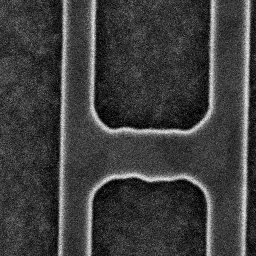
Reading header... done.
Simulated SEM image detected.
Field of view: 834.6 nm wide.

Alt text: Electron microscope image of one or a few lines or trenches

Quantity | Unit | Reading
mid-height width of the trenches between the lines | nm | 384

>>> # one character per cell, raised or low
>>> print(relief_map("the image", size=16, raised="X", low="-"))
----XX-------XXX
----XX-------XXX
----XX-------XXX
----XX-------XX-
----XX-------XX-
----XX-------XX-
----XX-------XX-
----XX-------XX-
----XXXXXXXXXXX-
----XXXXXXXXXXX-
----XXXXXXXXXXX-
----XX------XXX-
----XX-------XX-
----XX-------XX-
----XX-------XX-
----XX-------XX-